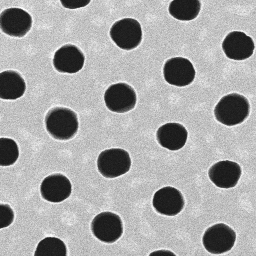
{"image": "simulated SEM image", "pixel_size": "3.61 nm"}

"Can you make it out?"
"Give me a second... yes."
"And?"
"a regular array of holes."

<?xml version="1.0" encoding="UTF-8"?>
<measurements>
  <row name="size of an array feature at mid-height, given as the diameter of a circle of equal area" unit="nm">106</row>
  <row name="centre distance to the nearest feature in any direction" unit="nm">230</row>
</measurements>